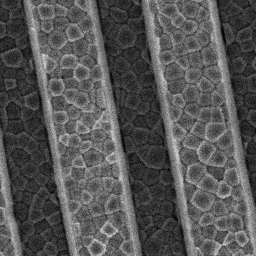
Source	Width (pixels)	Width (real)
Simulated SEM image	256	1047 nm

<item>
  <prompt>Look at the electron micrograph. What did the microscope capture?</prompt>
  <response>one or a few lines or trenches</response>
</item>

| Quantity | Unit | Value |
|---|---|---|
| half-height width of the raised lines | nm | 267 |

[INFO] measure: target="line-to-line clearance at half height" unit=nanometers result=212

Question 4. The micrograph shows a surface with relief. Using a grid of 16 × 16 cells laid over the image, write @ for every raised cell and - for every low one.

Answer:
--@@@@---@@@@---
--@@@@---@@@@@--
--@@@@---@@@@@--
--@@@@----@@@@--
--@@@@@---@@@@--
---@@@@---@@@@--
---@@@@---@@@@--
---@@@@---@@@@@-
---@@@@----@@@@-
---@@@@----@@@@-
----@@@@---@@@@-
----@@@@---@@@@-
@---@@@@---@@@@@
@---@@@@----@@@@
@---@@@@----@@@@
@---@@@@@---@@@@